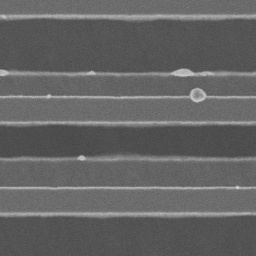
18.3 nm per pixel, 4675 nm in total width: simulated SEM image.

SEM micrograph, lines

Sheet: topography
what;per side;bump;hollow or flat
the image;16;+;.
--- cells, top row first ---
++++++++++++++++
................
................
................
...........+....
++++++++++++++++
++++++++++++++++
++++++++++++++++
................
................
++++++++++++++++
++++++++++++++++
++++++++++++++++
................
................
................